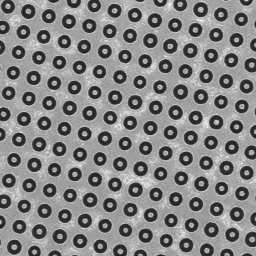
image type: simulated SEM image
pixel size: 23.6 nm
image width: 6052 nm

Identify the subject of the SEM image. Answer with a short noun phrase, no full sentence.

a regular array of ring-shaped grooves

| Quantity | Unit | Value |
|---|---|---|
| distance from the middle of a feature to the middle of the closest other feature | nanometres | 489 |